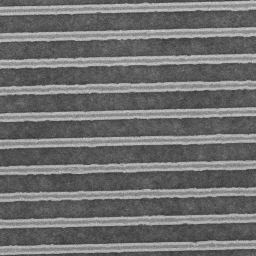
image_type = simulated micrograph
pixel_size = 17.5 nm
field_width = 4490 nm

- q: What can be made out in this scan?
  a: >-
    parallel lines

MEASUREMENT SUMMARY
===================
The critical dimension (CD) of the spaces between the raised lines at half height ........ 0.359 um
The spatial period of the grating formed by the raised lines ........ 466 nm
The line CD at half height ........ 103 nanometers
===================